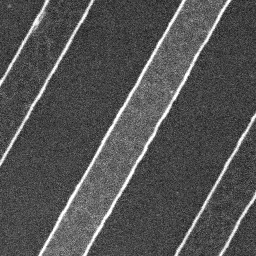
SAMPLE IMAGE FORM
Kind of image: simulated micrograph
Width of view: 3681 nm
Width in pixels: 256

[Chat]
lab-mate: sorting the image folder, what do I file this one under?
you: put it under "one or a few lines or trenches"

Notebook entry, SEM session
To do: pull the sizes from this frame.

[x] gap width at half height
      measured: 79 px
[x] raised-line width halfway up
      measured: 567 nm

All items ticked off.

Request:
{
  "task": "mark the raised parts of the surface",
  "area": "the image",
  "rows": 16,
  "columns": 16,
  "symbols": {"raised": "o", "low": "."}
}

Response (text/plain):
...ooo.....ooo..
..ooo......oo...
..oo......ooo...
.ooo......oo....
ooo......ooo....
ooo.....ooo.....
oo......ooo.....
oo.....ooo......
o......ooo.....o
......ooo......o
......oo......oo
.....ooo......oo
....ooo......ooo
....ooo.....ooo.
...ooo......ooo.
...ooo.....ooo..